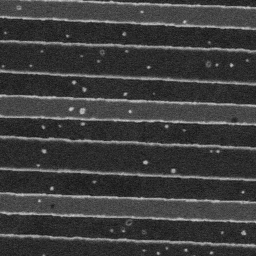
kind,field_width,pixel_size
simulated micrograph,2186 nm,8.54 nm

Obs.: lines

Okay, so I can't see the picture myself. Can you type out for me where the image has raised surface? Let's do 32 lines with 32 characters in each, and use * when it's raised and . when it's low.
*******************.............
********************************
........************************
.............................***
................................
***********.....................
********************************
********************************
********************************
...........*********************
..............................**
................................
***************.................
********************************
********************************
.............................***
................................
*********.......................
********************************
********************************
********************************
.........***********************
................................
................................
********........................
********************************
********************************
.........................*******
................................
****............................
*****************************...
********************************